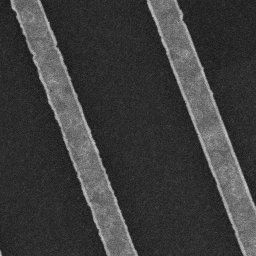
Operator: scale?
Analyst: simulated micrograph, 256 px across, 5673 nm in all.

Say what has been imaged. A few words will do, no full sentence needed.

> one or a few lines or trenches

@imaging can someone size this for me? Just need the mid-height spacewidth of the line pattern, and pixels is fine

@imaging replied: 102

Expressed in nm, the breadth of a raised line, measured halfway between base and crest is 556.